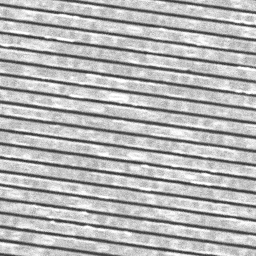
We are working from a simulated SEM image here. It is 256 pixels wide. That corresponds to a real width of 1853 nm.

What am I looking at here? parallel lines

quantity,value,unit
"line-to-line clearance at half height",25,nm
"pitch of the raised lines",99.3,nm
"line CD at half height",73.4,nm